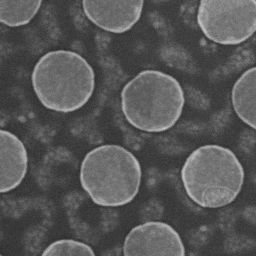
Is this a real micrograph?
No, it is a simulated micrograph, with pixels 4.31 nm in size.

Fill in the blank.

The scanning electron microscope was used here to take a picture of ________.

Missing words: raised bodies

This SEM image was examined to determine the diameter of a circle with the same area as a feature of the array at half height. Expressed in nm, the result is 256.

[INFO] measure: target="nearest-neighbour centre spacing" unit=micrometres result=0.38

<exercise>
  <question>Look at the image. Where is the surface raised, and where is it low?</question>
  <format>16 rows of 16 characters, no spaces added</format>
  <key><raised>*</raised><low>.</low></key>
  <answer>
**...****...****
*.....**.....***
.............**.
...**...........
..****...*......
..****..***....*
...**...***....*
........***....*
*...............
**....**....**..
**...****...***.
*....****...***.
......**....*...
................
........***.....
...**...***.....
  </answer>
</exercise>